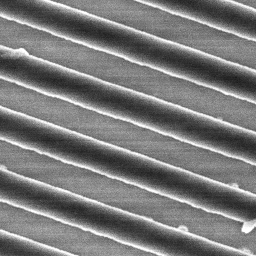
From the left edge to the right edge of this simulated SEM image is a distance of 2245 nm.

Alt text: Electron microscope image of lines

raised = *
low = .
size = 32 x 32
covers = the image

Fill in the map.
********..........************..
***********..........***********
..***********...........********
....************...........*****
.......************...........**
..........************..........
***..........************.......
******..........************....
********...........************.
***********...........**********
..************...........*******
.....************...........****
........************...........*
*..........************.........
***...........************......
*******..........************...
*********...........************
.***********...........*********
...************...........******
......************..........****
.........************..........*
*...........************........
****...........***********......
*******...........************..
**********...........***********
.************...........********
....************..........******
.......************...........**
..........************........**
**...........************.......
*****..........************.....
********...........************.